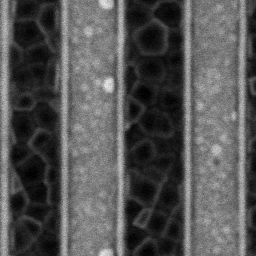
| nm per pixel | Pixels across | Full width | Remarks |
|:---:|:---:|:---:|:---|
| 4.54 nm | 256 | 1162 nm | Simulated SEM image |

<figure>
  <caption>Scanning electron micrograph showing one or a few lines or trenches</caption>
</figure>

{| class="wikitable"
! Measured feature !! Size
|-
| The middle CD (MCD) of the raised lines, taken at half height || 293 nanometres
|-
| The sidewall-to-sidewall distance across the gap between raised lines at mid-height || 246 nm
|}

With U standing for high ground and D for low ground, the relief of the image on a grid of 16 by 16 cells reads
UUUUDDDDUUUUDDDU
UUUUDDDDUUUUDDDU
UUUUDDDDUUUUDDDU
UUUUDDDDUUUUDDDU
UUUUDDDDUUUUDDDU
UUUUDDDDUUUUDDDU
UUUUDDDDUUUUDDDU
UUUUDDDDUUUUDDDU
UUUUDDDDUUUUDDDU
UUUUDDDDUUUUDDDU
UUUUDDDDUUUUDDDU
UUUUDDDDUUUUDDDU
UUUUDDDDUUUUDDDU
UUUUDDDDUUUUDDDU
UUUUDDDDUUUUDDDU
UUUUDDDDUUUUDDDU